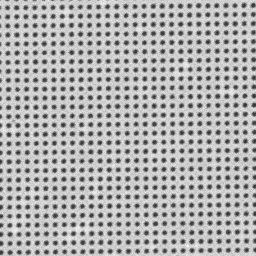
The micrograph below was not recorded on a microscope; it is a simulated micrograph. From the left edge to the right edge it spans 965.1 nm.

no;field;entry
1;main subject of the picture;a regular array of holes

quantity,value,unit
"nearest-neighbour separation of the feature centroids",32.4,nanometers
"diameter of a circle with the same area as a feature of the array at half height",0.019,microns